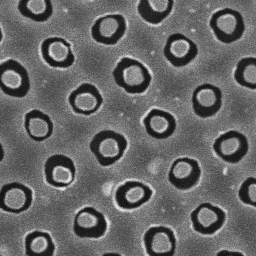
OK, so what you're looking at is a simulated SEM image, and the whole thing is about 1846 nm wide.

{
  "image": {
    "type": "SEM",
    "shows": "a regular array of ring-shaped grooves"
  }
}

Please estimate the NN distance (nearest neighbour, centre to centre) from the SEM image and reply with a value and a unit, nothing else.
366 nm